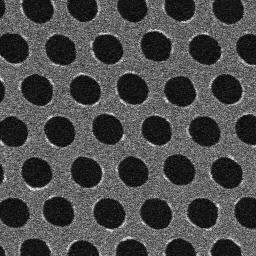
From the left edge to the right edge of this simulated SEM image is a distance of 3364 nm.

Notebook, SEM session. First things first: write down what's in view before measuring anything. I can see a regular array of holes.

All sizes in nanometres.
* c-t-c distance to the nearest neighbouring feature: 608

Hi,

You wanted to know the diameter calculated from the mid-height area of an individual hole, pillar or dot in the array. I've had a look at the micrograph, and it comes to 409 nanometers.